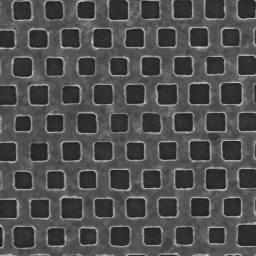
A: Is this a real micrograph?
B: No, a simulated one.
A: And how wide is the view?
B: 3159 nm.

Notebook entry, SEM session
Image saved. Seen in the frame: a regular array of holes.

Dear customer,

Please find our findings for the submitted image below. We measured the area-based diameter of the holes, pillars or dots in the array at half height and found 257 nm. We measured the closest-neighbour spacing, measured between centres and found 31.9 px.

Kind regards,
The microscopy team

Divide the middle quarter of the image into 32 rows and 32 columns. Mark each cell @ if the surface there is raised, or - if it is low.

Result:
@@@-----@@@-----@@@-----@@@-----
@@@@----@@@-----@@@-----@@@-----
@@@@---@@@@@----@@@@----@@@@----
@@@@@@@@@@@@@@@@@@@@@@@@@@@@@@@@
@@@@@@@@@@@@@@@@@@@@@@@@@@@@@@@@
---@@@@@----@@@@----@@@-----@@@-
----@@@-----@@@-----@@@-----@@@-
----@@@-----@@@-----@@@-----@@@-
----@@@-----@@@-----@@@-----@@@-
----@@@@----@@@@----@@@-----@@@-
@@@@@@@@@@@@@@@@@@@@@@@@@@@@@@@@
@@@@@@@@@@@@@@@@@@@@@@@@@@@@@@@@
@@@@----@@@@---@@@@@----@-@@----
@@@-----@@@@----@@@-----@@@-----
@@@-----@@@@----@@@-----@@@-----
@@@-----@@@@----@@@-----@@@-----
@@@-----@@@@----@@@@----@@@@----
@@@@@@@@@@@@@@@@@@@@@@@@@@@@@@@@
@@@@@@@@@@@@@@@@@@@@@@@@@@@@@@@@
---@@@@@---@@@@@@@@@@@@@----@@@@
----@@@-----@@@@----@@@@----@@@-
----@@@-----@@@@----@@@@----@@@-
----@@@-----@@@@----@@@@----@@@-
----@@@-----@@@@----@@@@----@@@@
@@@@@@@@@@@@@@@@@@@@@@@@@@@@@@@@
@@@@@@@@@@@@@@@@@@@@@@@@@@@@@@@@
@@@@@@@@@@@@----@@@@@--@@@@@----
@@@@----@@@-----@@@@----@@@@----
@@@@----@@@-----@@@@----@@@@----
@@@@----@@@-----@@@@----@@@@----
@@@@----@@@@----@@@@----@@@@----
@@@@@@@@@@@@@---@@@@@@@@@@@@@@@@